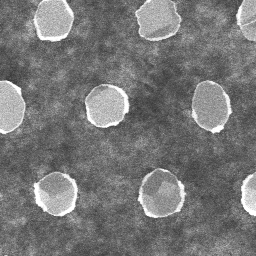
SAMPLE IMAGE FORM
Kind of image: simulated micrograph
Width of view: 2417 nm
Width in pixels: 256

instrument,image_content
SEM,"raised bodies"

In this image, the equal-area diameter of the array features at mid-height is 0.413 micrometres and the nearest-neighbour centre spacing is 953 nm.